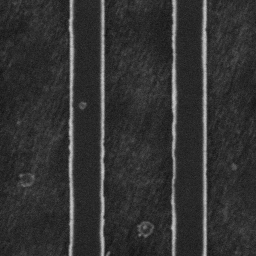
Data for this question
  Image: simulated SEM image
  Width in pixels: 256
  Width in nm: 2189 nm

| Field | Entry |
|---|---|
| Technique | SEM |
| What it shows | lines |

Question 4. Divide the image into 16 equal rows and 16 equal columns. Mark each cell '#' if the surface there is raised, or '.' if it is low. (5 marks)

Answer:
....##.....##...
....##.....##...
....##.....##...
....##.....##...
....##.....##...
....##.....##...
....##.....##...
....##.....##...
....##.....##...
....##.....##...
....##.....##...
....##.....##...
....##.....##...
....##.....##...
....##.....##...
....##.....##...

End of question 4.